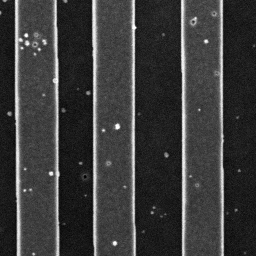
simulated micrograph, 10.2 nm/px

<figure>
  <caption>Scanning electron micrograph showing lines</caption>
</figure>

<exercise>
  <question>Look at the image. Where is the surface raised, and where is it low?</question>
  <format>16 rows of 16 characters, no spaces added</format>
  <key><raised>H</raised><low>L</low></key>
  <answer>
LHHLLLHHLLLHHHLL
LHHLLLHHLLLHHHLL
LHHHLLHHLLLHHHLL
LHHHLLHHLLLHHHLL
LHHHLLHHLLLHHHLL
LHHHLLHHLLLHHHLL
LHHHLLHHLLLHHHLL
LHHHLLHHLLLHHHLL
LHHHLLHHLLLHHHLL
LHHHLLHHLLLHHHLL
LHHHLLHHLLLHHHLL
LHHHLLHHLLLHHHLL
LHHHLLHHLLLHHHLL
LHHHLLHHLLLHHHLL
LHHHLLHHLLLHHHLL
LHHHLLHHLLLHHHLL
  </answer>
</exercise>